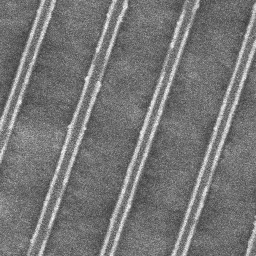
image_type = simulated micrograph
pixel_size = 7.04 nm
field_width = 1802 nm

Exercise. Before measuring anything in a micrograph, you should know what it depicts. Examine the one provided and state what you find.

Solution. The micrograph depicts one or a few lines or trenches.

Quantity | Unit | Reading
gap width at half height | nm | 387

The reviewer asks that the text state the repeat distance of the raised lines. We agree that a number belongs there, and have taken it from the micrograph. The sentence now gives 480 nanometres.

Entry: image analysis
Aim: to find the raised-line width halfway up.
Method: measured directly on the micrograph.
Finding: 94.1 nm